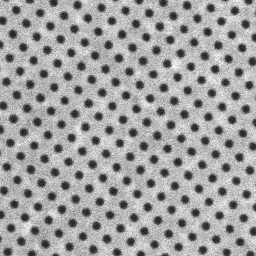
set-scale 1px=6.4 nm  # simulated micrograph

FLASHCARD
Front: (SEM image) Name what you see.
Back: a regular array of holes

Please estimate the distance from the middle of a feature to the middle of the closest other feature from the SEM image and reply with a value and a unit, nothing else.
107 nanometres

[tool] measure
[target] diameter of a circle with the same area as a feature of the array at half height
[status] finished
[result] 8.75 pixels